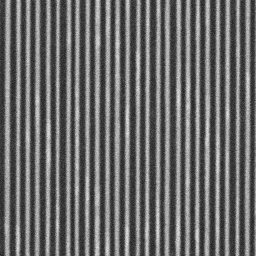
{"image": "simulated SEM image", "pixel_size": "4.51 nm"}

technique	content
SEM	parallel lines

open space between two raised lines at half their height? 25.9 nm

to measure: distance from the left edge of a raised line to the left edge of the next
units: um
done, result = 0.0451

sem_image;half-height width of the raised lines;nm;16.9